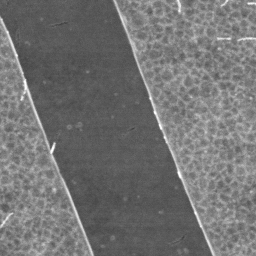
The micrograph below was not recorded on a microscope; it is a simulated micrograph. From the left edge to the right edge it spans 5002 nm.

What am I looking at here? one or a few lines or trenches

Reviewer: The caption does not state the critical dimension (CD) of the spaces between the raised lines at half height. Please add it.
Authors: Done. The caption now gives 111 pixels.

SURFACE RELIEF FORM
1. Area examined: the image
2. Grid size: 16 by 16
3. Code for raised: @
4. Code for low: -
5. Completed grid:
-------@@@@@@@@@
--------@@@@@@@@
@-------@@@@@@@@
@-------@@@@@@@@
@--------@@@@@@@
@@-------@@@@@@@
@@--------@@@@@@
@@--------@@@@@@
@@@-------@@@@@@
@@@--------@@@@@
@@@@-------@@@@@
@@@@-------@@@@@
@@@@--------@@@@
@@@@@-------@@@@
@@@@@--------@@@
@@@@@@-------@@@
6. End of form